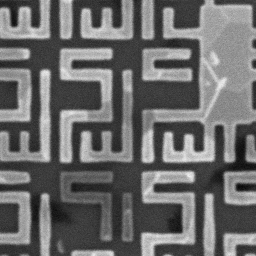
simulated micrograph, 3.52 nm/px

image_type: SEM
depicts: wiring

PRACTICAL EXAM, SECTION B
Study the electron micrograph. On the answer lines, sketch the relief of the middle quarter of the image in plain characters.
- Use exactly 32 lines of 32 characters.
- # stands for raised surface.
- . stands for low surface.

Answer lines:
##..................##..........
##..#####...........######.#####
############...##...############
############...##...############
.........###...##...............
..........##...##...............
..........##...##...............
..........##...##...............
..........##...##...............
..........##...##...............
..........##...##...............
.........###...##...............
############...##...############
############...##...############
##.............##...###.........
##.............##...##..........
##.............##...##..........
##..###...##...##...##...##.....
##..###...##...##...##...##...##
##..###...##...##...##...##...##
##..###...##...##...##...##...##
##..###...##...##...##...##...##
##..#############...##...#######
##..#############...##...#######
##..................##..........
................................
................................
############........############
############........############
##..####............######......
##..................##..........
##..................##..........